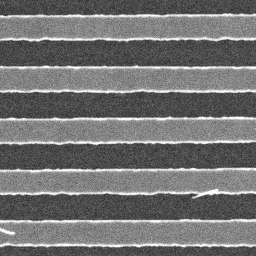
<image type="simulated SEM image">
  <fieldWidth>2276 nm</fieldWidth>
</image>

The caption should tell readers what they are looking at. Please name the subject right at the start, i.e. lines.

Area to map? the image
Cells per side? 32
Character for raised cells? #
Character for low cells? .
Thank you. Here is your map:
................................
................................
################################
################################
################################
................................
................................
................................
################################
################################
################################
.............#.#................
................................
................................
................................
################################
################################
################################
................................
................................
................................
################################
################################
################################
................................
................................
................................
......................###...####
################################
################################
################################
................................